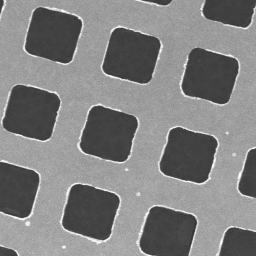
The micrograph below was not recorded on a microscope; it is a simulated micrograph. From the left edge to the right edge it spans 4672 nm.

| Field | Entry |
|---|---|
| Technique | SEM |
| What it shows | holes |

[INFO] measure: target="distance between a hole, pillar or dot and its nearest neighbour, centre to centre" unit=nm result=1470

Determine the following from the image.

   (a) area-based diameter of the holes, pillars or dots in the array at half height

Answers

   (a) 1010 nanometres